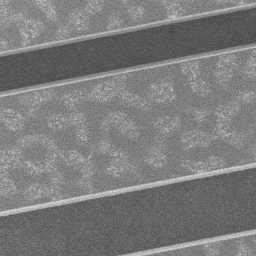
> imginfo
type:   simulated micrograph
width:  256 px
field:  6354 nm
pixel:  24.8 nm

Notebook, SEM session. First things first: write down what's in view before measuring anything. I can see one or a few lines or trenches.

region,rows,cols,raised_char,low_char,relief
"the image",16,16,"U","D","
UUUUUUUUUUUUUUUD
UUUUUUUUUUDDDDDD
UUUUUDDDDDDDDDDD
DDDDDDDDDDDDDUUU
DDDDDDDUUUUUUUUU
DDUUUUUUUUUUUUUU
UUUUUUUUUUUUUUUU
UUUUUUUUUUUUUUUU
UUUUUUUUUUUUUUUU
UUUUUUUUUUUUUUUU
UUUUUUUUUUUUUUUD
UUUUUUUUUUDDDDDD
UUUUUDDDDDDDDDDD
DDDDDDDDDDDDDDDD
DDDDDDDDDDDDDDDD
DDDDDDDDDDDUUUUU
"